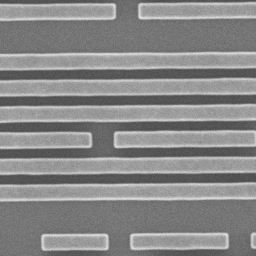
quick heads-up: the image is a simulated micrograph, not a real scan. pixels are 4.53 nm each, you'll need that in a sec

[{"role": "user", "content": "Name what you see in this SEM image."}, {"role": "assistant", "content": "groups of lines, slits or small figures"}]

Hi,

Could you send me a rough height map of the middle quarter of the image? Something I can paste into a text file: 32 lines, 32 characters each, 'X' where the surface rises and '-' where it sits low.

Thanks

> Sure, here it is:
XXXXXXXXXXXXXXXXXXXXXXXXXXXXXXXX
--------------------------------
--------------------------------
--------------------------------
XXXXXXXXXXXXXXXXXXXXXXXXXXXXXXXX
XXXXXXXXXXXXXXXXXXXXXXXXXXXXXXXX
XXXXXXXXXXXXXXXXXXXXXXXXXXXXXXXX
XXXXXXXXXXXXXXXXXXXXXXXXXXXXXXXX
--------------------------------
--------------------------------
------------------------XXXXXXXX
XXXXXXXXXXXXXXXXXXXXXXXXXXXXXXXX
XXXXXXXXXXXXXXXXXXXXXXXXXXXXXXXX
XXXXXXXXXXXXXXXXXXXXXXXXXXXXXXXX
--------------------------------
--------------------------------
--------------------------------
XXXXXXX------XXXXXXXXXXXXXXXXXXX
XXXXXXX------XXXXXXXXXXXXXXXXXXX
XXXXXXX------XXXXXXXXXXXXXXXXXXX
XXXXXXX------XXXXXXXXXXXXXXXXXXX
--------------------------------
--------------------------------
------------------------XXXXXXXX
XXXXXXXXXXXXXXXXXXXXXXXXXXXXXXXX
XXXXXXXXXXXXXXXXXXXXXXXXXXXXXXXX
XXXXXXXXXXXXXXXXXXXXXXXXXXXXXXXX
--------------------------------
--------------------------------
--------------------------------
XXXXXXXXXXXXXXXXXXXXXXXXXXXXXXXX
XXXXXXXXXXXXXXXXXXXXXXXXXXXXXXXX